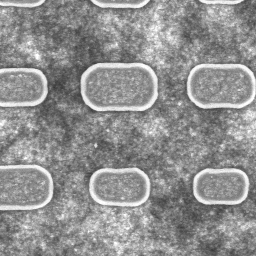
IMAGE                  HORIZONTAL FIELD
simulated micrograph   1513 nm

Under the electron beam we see raised bodies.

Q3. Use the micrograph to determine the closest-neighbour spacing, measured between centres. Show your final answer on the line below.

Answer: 0.592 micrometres